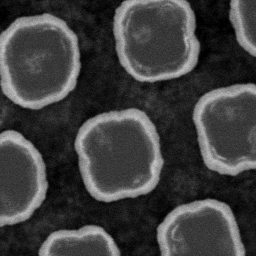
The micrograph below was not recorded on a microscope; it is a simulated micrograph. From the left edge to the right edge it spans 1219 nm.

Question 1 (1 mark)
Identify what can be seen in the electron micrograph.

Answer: raised bodies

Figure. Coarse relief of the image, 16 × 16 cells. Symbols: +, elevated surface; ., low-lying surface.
........++++...+
.+++...+++++...+
+++++..+++++...+
+++++...++++....
+++++...+++.....
++++...........+
.++..........+++
......+++...++++
+....+++++...+++
++...+++++...+++
+++..+++++....+.
+++...+++.......
++..............
++.........+++..
.....+....+++++.
...++++...+++++.